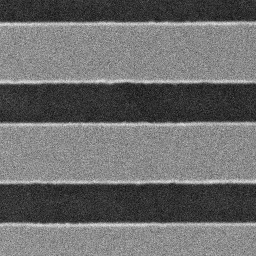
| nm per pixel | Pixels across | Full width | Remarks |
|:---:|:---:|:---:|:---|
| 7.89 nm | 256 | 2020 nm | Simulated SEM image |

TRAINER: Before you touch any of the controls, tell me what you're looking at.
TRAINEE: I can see lines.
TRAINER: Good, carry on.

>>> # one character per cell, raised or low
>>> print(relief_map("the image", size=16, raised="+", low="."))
................
++++++++++++++++
++++++++++++++++
++++++++++++++++
++++++++++++++++
................
................
................
++++++++++++++++
++++++++++++++++
++++++++++++++++
................
................
................
++++++++++++++++
++++++++++++++++